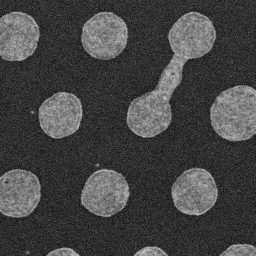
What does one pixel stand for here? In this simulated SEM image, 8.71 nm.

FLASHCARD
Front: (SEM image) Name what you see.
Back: raised bodies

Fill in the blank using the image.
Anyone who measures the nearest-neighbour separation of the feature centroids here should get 781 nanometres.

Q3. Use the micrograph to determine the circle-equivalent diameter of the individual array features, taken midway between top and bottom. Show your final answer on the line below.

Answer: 390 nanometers